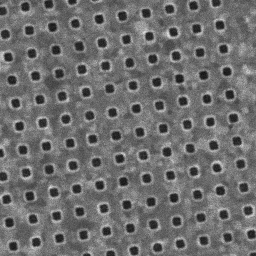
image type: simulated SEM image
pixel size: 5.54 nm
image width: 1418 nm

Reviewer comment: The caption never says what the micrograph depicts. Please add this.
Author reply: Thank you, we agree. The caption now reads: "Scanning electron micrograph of a regular array of holes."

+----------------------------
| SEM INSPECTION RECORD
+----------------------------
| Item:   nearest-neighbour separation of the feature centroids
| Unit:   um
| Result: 0.128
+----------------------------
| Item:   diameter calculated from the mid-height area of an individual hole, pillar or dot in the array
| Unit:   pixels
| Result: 10.8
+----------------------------